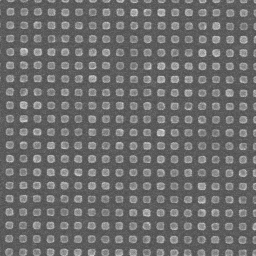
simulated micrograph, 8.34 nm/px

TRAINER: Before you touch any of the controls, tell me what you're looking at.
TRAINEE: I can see a regular array of raised bodies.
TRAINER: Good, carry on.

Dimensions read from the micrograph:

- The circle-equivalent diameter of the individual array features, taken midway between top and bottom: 7.7 pixels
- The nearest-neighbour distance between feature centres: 0.11 microns